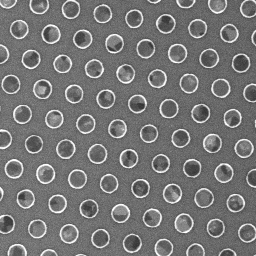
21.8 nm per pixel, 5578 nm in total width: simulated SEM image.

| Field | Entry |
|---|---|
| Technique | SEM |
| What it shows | a regular array of raised bodies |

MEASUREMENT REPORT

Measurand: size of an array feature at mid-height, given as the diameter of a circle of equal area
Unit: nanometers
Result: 387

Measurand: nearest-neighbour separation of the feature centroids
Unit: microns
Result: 0.694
